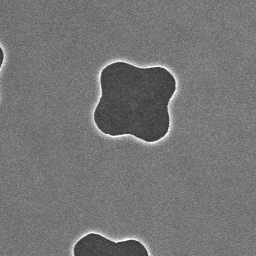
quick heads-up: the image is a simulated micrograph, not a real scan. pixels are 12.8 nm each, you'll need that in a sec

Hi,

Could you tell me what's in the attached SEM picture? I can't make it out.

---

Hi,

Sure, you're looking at holes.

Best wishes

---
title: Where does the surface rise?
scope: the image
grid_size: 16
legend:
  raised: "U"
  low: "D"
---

UUUUUUUUUUUUUUUU
UUUUUUUUUUUUUUUU
UUUUUUUUUUUUUUUU
UUUUUUUUUUUUUUUU
UUUUUUDDDDDUUUUU
UUUUUUDDDDDUUUUU
UUUUUUDDDDDUUUUU
UUUUUUDDDDDUUUUU
UUUUUUUUDDUUUUUU
UUUUUUUUUUUUUUUU
UUUUUUUUUUUUUUUU
UUUUUUUUUUUUUUUU
UUUUUUUUUUUUUUUU
UUUUUUUUUUUUUUUU
UUUUUUUUUUUUUUUU
UUUUUDDDDUUUUUUU